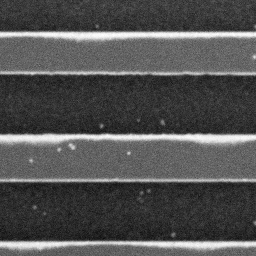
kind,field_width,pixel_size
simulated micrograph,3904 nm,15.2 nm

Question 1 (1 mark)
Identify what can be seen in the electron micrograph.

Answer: lines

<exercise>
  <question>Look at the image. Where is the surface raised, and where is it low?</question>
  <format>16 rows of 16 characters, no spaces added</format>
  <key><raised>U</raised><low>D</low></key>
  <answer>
DDDDDDDDDDDDDDDD
DDDDDDDDDDDDDDDD
UUUUUUUUUUUUUUUU
UUUUUUUUUUUUUUUU
UUUUUUUUUUUUUUUU
DDDDDDDDDDDDDDDD
DDDDDDDDDDDDDDDD
DDDDDDDDDDDDDDDD
DDDUUUUUUUUUUDDD
UUUUUUUUUUUUUUUU
UUUUUUUUUUUUUUUU
DDDDDDDDDDDDDDDD
DDDDDDDDDDDDDDDD
DDDDDDDDDDDDDDDD
DDDDDDDDDDDDDDDD
UUUUUUUUUUUUUUUU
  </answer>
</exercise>